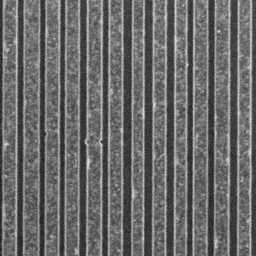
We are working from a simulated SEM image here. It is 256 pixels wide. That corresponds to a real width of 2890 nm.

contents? parallel lines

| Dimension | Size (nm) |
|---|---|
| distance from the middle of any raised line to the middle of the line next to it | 241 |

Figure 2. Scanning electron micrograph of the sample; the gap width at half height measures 79.1 nm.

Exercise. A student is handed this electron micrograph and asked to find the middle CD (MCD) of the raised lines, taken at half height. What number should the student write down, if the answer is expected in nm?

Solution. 157